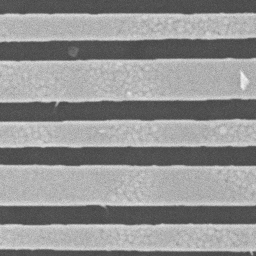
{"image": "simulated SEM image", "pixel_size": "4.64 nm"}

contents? lines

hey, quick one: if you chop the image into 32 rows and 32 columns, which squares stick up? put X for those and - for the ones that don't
--------------------------------
--------------------------------
XXXXXXXXXXXXXXXXXXXXXXXXXXXXXXXX
XXXXXXXXXXXXXXXXXXXXXXXXXXXXXXXX
XXXXXXXXXXXXXXXXXXXXXXXXXXXXXXXX
--------------------------------
--------------------------------
-------------------XXXXXXXXXXXXX
XXXXXXXXXXXXXXXXXXXXXXXXXXXXXXXX
XXXXXXXXXXXXXXXXXXXXXXXXXXXXXXXX
XXXXXXXXXXXXXXXXXXXXXXXXXXXXXXXX
XXXXXXXXXXXXXXXXXXXXXXXXXXXXXXXX
XXXXXXXXXXXXXXXXXXXXXXXXXX------
--------------------------------
--------------------------------
XXXXXXXXXXXXXXXXXXXXXXXXXXXXXXXX
XXXXXXXXXXXXXXXXXXXXXXXXXXXXXXXX
XXXXXXXXXXXXXXXXXXXXXXXXXXXXXXXX
--------------------------------
--------------------------------
--------------------------------
XXXXXXXXXXXXXXXXXXXXXXXXXXXXXXXX
XXXXXXXXXXXXXXXXXXXXXXXXXXXXXXXX
XXXXXXXXXXXXXXXXXXXXXXXXXXXXXXXX
XXXXXXXXXXXXXXXXXXXXXXXXXXXXXXXX
XXXXXXXXXXXXXXXXXXXXXXXXXXXXXXXX
--------------------------------
--------------------------------
XXXXXXXXXXXXXXXXXXXXXXXXXXXXXXXX
XXXXXXXXXXXXXXXXXXXXXXXXXXXXXXXX
XXXXXXXXXXXXXXXXXXXXXXXXXXXXXXXX
-------------------------------X